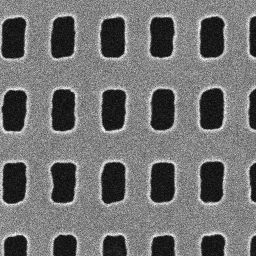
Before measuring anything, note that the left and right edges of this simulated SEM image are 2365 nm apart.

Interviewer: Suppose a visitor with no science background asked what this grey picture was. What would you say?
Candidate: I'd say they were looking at a regular array of holes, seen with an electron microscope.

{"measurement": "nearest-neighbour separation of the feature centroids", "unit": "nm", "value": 455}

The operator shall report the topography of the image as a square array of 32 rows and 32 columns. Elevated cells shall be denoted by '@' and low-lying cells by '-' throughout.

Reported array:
@@@@@@@@@@@@@@@@@@@@@@@@@@@@@@@@
@@@@@@@@@@@@@@@@@@@@@@@@@@@@@@@@
@--@@@@--@@@@--@@@@---@@@---@@@-
---@@@@--@@@@---@@@---@@@---@@@-
---@@@---@@@@---@@@---@@@---@@@-
---@@@---@@@@---@@@---@@@---@@@-
---@@@---@@@@--@@@@---@@@---@@@-
@@@@@@@@@@@@@@@@@@@@@@@@@@@@@@@@
@@@@@@@@@@@@@@@@@@@@@@@@@@@@@@@@
@@@@@@@@@@@@@@@@@@@@@@@@@@@@@@@@
@@@@@@@@@@@@@@@@@@@@@@@@@@@@@@@@
@--@@@@--@@@@---@@@---@@@@--@@@-
---@@@@--@@@@---@@@---@@@---@@@-
---@@@@--@@@@---@@@---@@@---@@@-
---@@@---@@@@---@@@---@@@---@@@-
---@@@---@@@@--@@@@---@@@---@@@-
@@@@@@@@@@@@@@@@@@@@@@@@@@@@@@@@
@@@@@@@@@@@@@@@@@@@@@@@@@@@@@@@@
@@@@@@@@@@@@@@@@@@@@@@@@@@@@@@@@
@@@@@@@@@@@@@@@@@@@@@@@@@@@@@@@@
@--@@@@--@@@@--@@@@--@@@@---@@@@
---@@@---@@@@---@@@---@@@---@@@-
---@@@@--@@@@---@@@---@@@---@@@-
---@@@@--@@@@---@@@---@@@---@@@-
---@@@---@@@@---@@@---@@@---@@@-
@@@@@@@@@@@@@-@@@@@@@@@@@@@@@@@@
@@@@@@@@@@@@@@@@@@@@@@@@@@@@@@@@
@@@@@@@@@@@@@@@@@@@@@@@@@@@@@@@@
@@@@@@@@@@@@@@@@@@@@@@@@@@@@@@@@
@@-@@@@--@@@@@@@@@@@-@@@@@--@@@@
@--@@@@---@@@---@@@---@@@---@@@-
---@@@@---@@@---@@@---@@@---@@@-